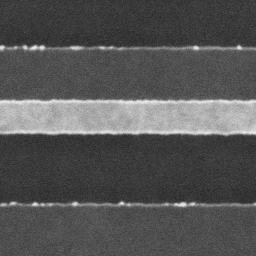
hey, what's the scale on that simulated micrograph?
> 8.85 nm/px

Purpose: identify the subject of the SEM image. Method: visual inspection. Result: lines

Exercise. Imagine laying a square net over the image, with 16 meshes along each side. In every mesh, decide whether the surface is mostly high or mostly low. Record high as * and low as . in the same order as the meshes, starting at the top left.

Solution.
................
................
................
****************
****************
****************
****************
****************
................
................
................
................
................
****************
****************
****************